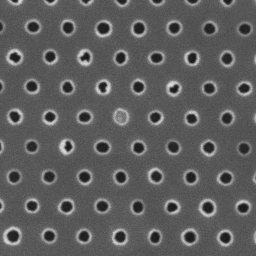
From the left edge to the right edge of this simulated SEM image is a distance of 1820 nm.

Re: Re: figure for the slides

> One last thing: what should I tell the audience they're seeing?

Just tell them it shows a regular array of holes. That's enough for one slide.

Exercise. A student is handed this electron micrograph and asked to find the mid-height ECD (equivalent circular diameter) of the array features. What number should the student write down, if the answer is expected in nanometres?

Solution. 84.1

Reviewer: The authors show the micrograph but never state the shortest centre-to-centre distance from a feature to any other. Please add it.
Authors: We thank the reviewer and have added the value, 0.242 micrometres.